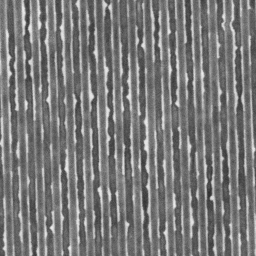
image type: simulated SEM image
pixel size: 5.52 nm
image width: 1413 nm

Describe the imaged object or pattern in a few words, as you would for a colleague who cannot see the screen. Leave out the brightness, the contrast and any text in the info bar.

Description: parallel lines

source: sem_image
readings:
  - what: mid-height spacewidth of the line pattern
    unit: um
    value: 0.0352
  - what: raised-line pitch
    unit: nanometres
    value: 89.1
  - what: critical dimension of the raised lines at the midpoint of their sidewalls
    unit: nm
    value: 52.4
